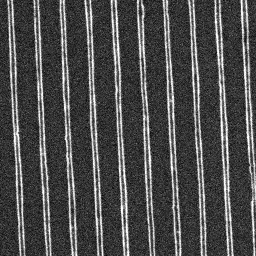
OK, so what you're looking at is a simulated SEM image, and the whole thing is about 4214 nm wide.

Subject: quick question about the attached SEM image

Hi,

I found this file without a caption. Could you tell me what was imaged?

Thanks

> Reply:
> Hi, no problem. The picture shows parallel lines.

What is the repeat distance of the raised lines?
427 nanometers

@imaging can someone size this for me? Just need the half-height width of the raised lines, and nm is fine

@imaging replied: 71.9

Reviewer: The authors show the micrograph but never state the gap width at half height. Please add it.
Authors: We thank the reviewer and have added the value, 351 nanometres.